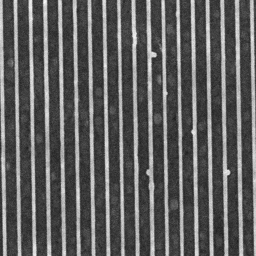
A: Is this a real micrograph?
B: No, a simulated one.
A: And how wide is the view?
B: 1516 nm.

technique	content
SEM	parallel lines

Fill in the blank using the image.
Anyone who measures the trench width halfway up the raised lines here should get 0.0666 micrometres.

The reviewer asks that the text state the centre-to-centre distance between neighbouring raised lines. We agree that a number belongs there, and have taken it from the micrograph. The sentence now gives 87.4 nm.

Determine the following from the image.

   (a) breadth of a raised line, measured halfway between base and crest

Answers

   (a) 0.0178 um